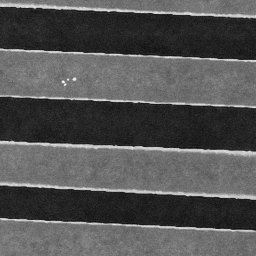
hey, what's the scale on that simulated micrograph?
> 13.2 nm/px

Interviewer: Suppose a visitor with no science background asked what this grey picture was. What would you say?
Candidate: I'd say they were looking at lines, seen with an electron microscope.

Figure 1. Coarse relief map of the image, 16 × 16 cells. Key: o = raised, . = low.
...ooooooooooooo
................
................
ooooooooo.......
oooooooooooooooo
oooooooooooooooo
...........ooooo
................
................
ooooooooooooooo.
oooooooooooooooo
oooooooooooooooo
................
................
oooooooooooooooo
oooooooooooooooo